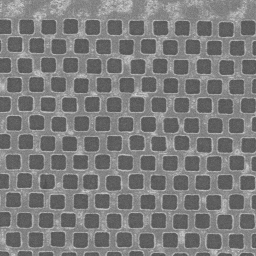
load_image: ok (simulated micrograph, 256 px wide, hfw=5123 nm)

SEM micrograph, a regular array of holes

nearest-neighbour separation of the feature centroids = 0.431 µm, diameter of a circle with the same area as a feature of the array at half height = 336 nm